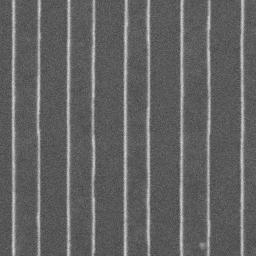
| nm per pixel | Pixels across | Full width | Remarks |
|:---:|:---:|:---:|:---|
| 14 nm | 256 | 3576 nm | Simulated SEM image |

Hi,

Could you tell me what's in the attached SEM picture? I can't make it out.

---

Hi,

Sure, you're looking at lines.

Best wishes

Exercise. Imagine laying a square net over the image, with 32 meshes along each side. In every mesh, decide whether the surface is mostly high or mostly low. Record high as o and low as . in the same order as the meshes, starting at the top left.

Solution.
..ooo....ooo....ooo....ooo....oo
..ooo....ooo....oo.....ooo....oo
..ooo....ooo....ooo....ooo....oo
..ooo....ooo....ooo....ooo....oo
..ooo....ooo....ooo....ooo....oo
..ooo....ooo....ooo....ooo....oo
..ooo....ooo....ooo....ooo....oo
..ooo....ooo....ooo....ooo....oo
..ooo....ooo....ooo....ooo....oo
..ooo...oooo....ooo....ooo....oo
..ooo...oooo....ooo....ooo....oo
..ooo...oooo....ooo....ooo....oo
..ooo...oooo....ooo....ooo....oo
..ooo...oooo....ooo....ooo....oo
..ooo...oooo....ooo....ooo....oo
..ooo...oooo....oo.....ooo....oo
..ooo...oooo....oo.....ooo....oo
..ooo...oooo....ooo....ooo....oo
..ooo...oooo....ooo....ooo....oo
..ooo...oooo....ooo....ooo....oo
..ooo...oooo....ooo....ooo....oo
..ooo...oooo....ooo....ooo....oo
..ooo...oooo....ooo....ooo....oo
..ooo...oooo....ooo....ooo....oo
..ooo...oooo....oo.....ooo....oo
..ooo...oooo....oo.....ooo....oo
..ooo...oooo....ooo....ooo....oo
..ooo...oooo....ooo....ooo....oo
..ooo...oooo....oo.....ooo....oo
..ooo....ooo....ooo....ooo....oo
..ooo...oooo....ooo....ooo....oo
..ooo...oooo....ooo....ooo....oo